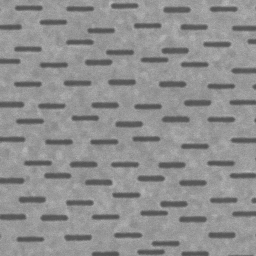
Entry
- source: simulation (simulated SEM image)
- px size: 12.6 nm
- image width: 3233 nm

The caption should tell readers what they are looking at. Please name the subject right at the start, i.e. a regular array of holes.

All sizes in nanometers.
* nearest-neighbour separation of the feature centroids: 350